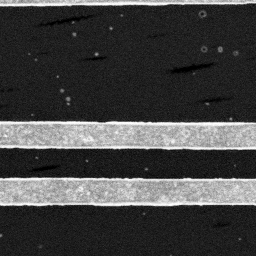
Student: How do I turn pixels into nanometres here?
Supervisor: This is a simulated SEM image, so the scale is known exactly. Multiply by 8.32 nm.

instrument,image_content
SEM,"lines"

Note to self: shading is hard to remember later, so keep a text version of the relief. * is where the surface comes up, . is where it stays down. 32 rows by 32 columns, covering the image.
***************.................
................................
................................
................................
................................
................................
................................
................................
................................
................................
................................
................................
................................
................................
................................
**************************....**
********************************
********************************
.........................*******
................................
................................
................................
********************************
********************************
********************************
********************************
................................
................................
................................
................................
................................
................................